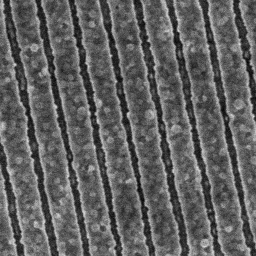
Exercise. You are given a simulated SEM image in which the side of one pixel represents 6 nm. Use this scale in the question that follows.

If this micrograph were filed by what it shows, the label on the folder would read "parallel lines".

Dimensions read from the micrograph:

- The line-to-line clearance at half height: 47.1 nm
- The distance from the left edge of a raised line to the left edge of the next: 194 nm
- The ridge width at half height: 148 nanometers